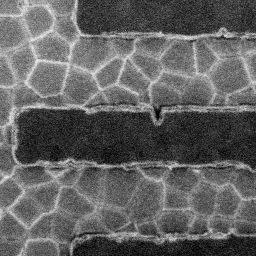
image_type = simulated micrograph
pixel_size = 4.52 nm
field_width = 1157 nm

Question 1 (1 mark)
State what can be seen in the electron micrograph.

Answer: one or a few lines or trenches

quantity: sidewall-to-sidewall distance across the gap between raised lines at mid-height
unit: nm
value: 316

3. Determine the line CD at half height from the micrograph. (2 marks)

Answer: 272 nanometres